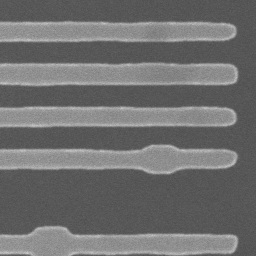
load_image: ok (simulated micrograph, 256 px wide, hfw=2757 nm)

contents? wiring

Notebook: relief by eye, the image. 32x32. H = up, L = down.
LLLLLLLLLLLLLLLLLLLLLLLLLLLLLLLL
LLLLLLLLLLLLLLLLLLLLLLLLLLLLLLLL
LLLLLLLLLLLLLLLLLLLLLLLLLLLLLLLL
HHHHHHHHHHHHHHHHHHHHHHHHHHHHHLLL
HHHHHHHHHHHHHHHHHHHHHHHHHHHHHLLL
LLLLLLLLLLLLLLLLLLLLLLLLLLLLLLLL
LLLLLLLLLLLLLLLLLLLLLLLLLLLLLLLL
LLLLLLLLLLLLLLLLLLLLLLLLLLLLLLLL
HHHHHHHHHHHHHHHHHHHHHHHHHHHHHLLL
HHHHHHHHHHHHHHHHHHHHHHHHHHHHHHLL
LLLHHHLLLLLLLLLLLLLLLLLLLLLLLLLL
LLLLLLLLLLLLLLLLLLLLLLLLLLLLLLLL
LLLLLLLLLLLLLLLLLLLLLLLLLLLLLLLL
LLLLHLHHHLLLHHHHLLLLLLLHHHLLLLLL
HHHHHHHHHHHHHHHHHHHHHHHHHHHHHLLL
HHHHHHHHHHHHHHHHHHHHHHHHHHHHHLLL
LLLLLLLLLLLLLLLLLLLLLLLLLLLLLLLL
LLLLLLLLLLLLLLLLLLLLLLLLLLLLLLLL
LLLLLLLLLLLLLLLLLLHHHHLLLLLLLLLL
HHHHHHHHHHHHHHHHHHHHHHHHHHHHHLLL
HHHHHHHHHHHHHHHHHHHHHHHHHHHHHLLL
LLLLLLLLLLLLLLLLLLLHHLLLLLLLLLLL
LLLLLLLLLLLLLLLLLLLLLLLLLLLLLLLL
LLLLLLLLLLLLLLLLLLLLLLLLLLLLLLLL
LLLLLLLLLLLLLLLLLLLLLLLLLLLLLLLL
LLLLLLLLLLLLLLLLLLLLLLLLLLLLLLLL
LLLLLLLLLLLLLLLLLLLLLLLLLLLLLLLL
LLLLLLLLLLLLLLLLLLLLLLLLLLLLLLLL
LLLLLLLLLLLLLLLLLLLLLLLLLLLLLLLL
HLLHHHHHHHLLHHHHHHHHHHHHHHHHHLLL
HHHHHHHHHHHHHHHHHHHHHHHHHHHHHLLL
HHHHHHHHHHHHHHHHHHHHHHHHHHHHHLLL